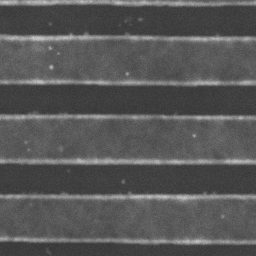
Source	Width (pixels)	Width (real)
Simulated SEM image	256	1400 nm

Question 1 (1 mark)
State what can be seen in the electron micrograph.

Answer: lines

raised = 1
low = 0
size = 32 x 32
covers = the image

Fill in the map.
10000000000000011111111111111111
00000000000000000000000000000000
00000000000000000000000000000000
00000000000000000000000000000000
11100000011111111000000000000000
11111111111111111111111111111111
11111111111111111111111111111111
11111111111111111111111111111111
11111111111111111111111111111111
11111111111111111111111111111111
00000000000000000000111111111111
00000000000000000000000000000000
00000000000000000000000000000000
00000000000000000000000000000000
11111111111111111111111110000000
11111111111111111111111111111111
11111111111111111111111111111111
11111111111111111111111111111111
11111111111111111111111111111111
11111111111111111111111111111111
00000000000000000000000000000000
00000000000000000000000000000000
00000000000000000000000000000000
00000000000000000000000000000000
11111111111111111111111111111111
11111111111111111111111111111111
11111111111111111111111111111111
11111111111111111111111111111111
11111111111111111111111111111111
11111111111111111111111111111111
00000000000000000000000000000000
00000000000000000000000000000000